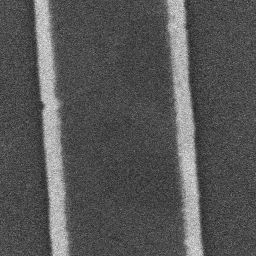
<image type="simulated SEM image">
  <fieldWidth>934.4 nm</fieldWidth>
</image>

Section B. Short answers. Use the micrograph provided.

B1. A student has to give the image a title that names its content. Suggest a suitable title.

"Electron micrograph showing one or a few lines or trenches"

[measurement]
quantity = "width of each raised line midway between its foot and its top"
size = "135 px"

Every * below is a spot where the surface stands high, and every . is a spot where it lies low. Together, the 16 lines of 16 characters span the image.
...********.....
...********.....
...********.....
...********.....
...********.....
...********.....
...*********....
...*********....
...*********....
...*********....
...*********....
...*********....
....********....
....********....
....********....
....********....